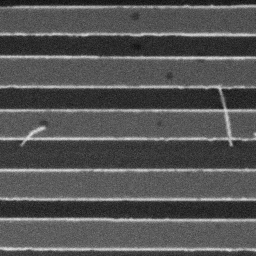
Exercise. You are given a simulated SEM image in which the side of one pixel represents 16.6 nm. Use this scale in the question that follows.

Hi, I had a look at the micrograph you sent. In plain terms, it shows lines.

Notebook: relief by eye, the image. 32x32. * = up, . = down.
................................
********************************
********************************
********************************
................................
................................
................................
********************************
********************************
********************************
********************************
................................
................................
................................
********************************
********************************
********************************
..**........................*.*.
................................
................................
................................
********************************
********************************
********************************
********************************
................................
................................
********************************
********************************
********************************
********************************
................................